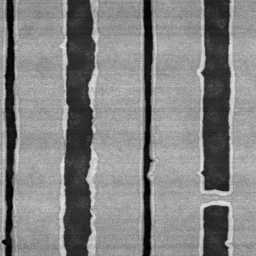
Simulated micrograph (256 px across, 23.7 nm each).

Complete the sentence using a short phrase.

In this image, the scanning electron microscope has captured one or a few lines or trenches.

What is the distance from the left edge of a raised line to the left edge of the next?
1640 nanometers